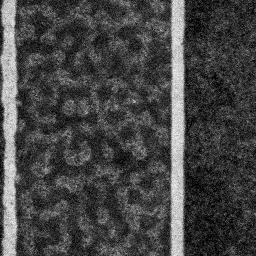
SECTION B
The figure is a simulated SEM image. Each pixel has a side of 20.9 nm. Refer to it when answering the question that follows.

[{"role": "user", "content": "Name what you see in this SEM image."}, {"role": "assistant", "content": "one or a few lines or trenches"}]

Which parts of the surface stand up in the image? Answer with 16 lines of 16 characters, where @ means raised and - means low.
@@@@@@@@@@@-----
@@@@@@@@@@@-----
@@@@@@@@@@@-----
-@@@@@@@@@@-----
-@@@@@@@@@@-----
-@@@@@@@@@@-----
-@@@@@@@@@@-----
-@@@@@@@@@@-----
-@@@@@@@@@@-----
-@@@@@@@@@@-----
-@@@@@@@@@@-----
-@@@@@@@@@@-----
-@@@@@@@@@@-----
-@@@@@@@@@@-----
-@@@@@@@@@@-----
@@@@@@@@@@@-----